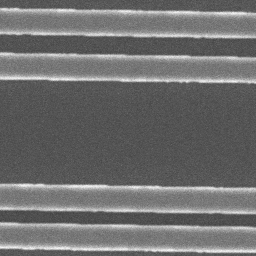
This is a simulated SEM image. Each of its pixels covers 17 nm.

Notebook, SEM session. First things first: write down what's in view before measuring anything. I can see lines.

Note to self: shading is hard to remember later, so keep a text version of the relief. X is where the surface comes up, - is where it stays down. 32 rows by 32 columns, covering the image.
--------------------------------
XXXXXXXXXXXXXXXXXXXXXXX---------
XXXXXXXXXXXXXXXXXXXXXXXXXXXXXXXX
XXXXXXXXXXXXXXXXXXXXXXXXXXXXXXXX
----------------XX-XXXXXXXXXXXXX
--------------------------------
--------------------------------
XXXXXXXXXXXXXXXXXXXXXXXXXXXXXXXX
XXXXXXXXXXXXXXXXXXXXXXXXXXXXXXXX
XXXXXXXXXXXXXXXXXXXXXXXXXXXXXXXX
--------------------------------
--------------------------------
--------------------------------
--------------------------------
--------------------------------
--------------------------------
--------------------------------
--------------------------------
--------------------------------
--------------------------------
--------------------------------
--------------------------------
--------------------------------
XXXXXXXXXXXXXXXXXXXXXXXXXXX-----
XXXXXXXXXXXXXXXXXXXXXXXXXXXXXXXX
XXXXXXXXXXXXXXXXXXXXXXXXXXXXXXXX
--------------------XXXXXXXXXXXX
--------------------------------
XXXXXXXXXXXXXXXXXXXXXXXXXXXXXXX-
XXXXXXXXXXXXXXXXXXXXXXXXXXXXXXXX
XXXXXXXXXXXXXXXXXXXXXXXXXXXXXXXX
--------------------------------